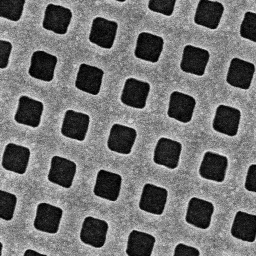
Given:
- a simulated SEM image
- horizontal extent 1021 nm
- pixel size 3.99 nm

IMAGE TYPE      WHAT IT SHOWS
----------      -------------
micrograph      a regular array of holes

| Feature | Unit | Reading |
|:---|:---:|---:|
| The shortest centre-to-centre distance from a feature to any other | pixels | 47.8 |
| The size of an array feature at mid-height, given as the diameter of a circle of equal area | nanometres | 118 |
